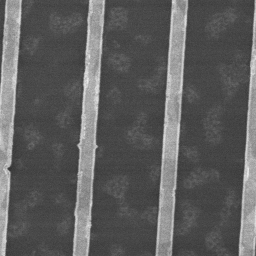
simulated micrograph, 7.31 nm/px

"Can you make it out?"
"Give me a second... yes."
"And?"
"one or a few lines or trenches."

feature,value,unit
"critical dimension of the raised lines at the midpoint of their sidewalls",0.101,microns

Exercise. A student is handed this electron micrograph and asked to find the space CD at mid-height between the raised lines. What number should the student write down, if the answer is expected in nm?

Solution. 502